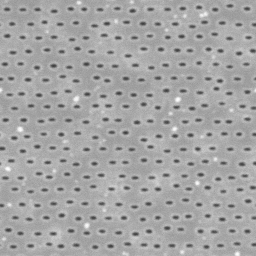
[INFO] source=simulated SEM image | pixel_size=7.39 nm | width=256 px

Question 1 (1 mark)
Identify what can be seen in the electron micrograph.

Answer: a regular array of holes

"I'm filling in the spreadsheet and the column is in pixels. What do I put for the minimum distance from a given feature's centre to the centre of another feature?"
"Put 13.8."